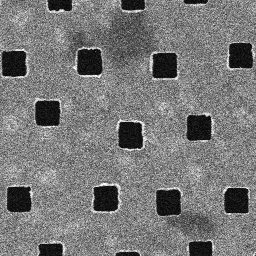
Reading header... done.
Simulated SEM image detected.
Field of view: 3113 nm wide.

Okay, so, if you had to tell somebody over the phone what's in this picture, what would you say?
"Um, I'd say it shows a regular array of holes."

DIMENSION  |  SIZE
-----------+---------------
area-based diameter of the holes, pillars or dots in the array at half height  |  339 nm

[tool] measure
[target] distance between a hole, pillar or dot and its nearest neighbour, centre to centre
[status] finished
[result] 823 nm